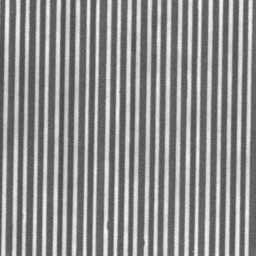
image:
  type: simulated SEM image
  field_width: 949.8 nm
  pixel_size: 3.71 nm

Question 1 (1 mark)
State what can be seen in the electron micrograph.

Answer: parallel lines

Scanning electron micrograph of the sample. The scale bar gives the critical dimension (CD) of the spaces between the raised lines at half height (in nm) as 24.1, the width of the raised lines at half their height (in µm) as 0.0135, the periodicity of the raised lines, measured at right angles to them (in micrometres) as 0.0376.